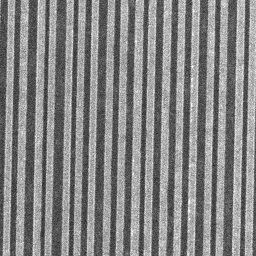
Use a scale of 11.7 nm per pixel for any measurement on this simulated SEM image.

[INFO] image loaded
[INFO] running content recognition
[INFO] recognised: parallel lines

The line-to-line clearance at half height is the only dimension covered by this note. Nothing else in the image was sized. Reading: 90.8 nanometres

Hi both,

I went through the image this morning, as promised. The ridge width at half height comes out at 79.1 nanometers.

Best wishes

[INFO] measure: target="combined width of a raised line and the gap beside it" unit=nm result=167